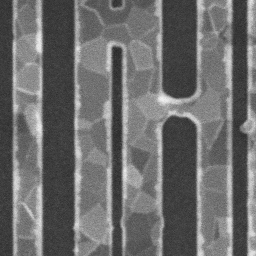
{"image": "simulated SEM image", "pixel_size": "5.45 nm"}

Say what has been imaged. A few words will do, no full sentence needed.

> one or a few lines or trenches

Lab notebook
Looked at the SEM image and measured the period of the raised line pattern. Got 339 nm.